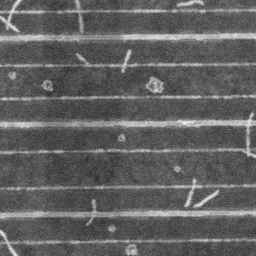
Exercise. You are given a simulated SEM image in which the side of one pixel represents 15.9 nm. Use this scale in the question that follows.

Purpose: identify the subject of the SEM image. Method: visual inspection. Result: lines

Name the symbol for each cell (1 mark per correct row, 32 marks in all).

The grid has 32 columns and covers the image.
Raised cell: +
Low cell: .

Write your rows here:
++++++++++++++++++++++++++++++++
++++++.+.++.....................
................................
................................
................................
................................
................................
................................
++++++++++++++++++++++++++++++++
++++++++++++++++++++++++++++++++
++++++++++++++++++++++++++++++++
++++++++++++++++++++++++++++++++
................................
................................
................................
.......................++.....++
................................
................................
................................
++++++++++++++++++++++++++++++++
++++++++++++++++++++++++++++++++
++++++++++++++++++++++++++++++++
++++++++++++++++++++++++++++++++
+++++...........................
................................
................................
...........+......++.+++++......
................................
................................
................................
++++++++++++++++++++++++++++++++
++++++++++++++++++++++++++++++++